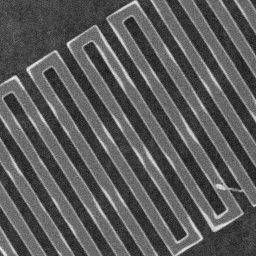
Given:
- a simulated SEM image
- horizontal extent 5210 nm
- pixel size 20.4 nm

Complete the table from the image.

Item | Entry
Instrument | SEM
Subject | groups of lines, slits or small figures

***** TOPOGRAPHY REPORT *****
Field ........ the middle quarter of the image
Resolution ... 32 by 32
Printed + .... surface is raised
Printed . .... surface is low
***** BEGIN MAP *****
+...+++....+++....+++....++++...
+....+++....+++....+++....+++...
++...++++....+++....+++...++++..
++....+++....+++....+++....+++..
+++....+++....+++....+++....+++.
++++...++++...++++...++++...++++
.+++....+++....+++....+++....+++
..+++...++++....+++....+++....++
..++++...++++...++++...++++...++
...+++....+++....+++....+++....+
...++++...++++....+++....+++...+
+...++++...+++....+++....++++...
+....+++....+++....+++....+++...
++...++++....+++...++++...++++..
++....+++....+++....+++....+++..
+++...++++....+++....+++....+++.
++++...+++....++++...++++...+++.
.+++....+++....+++....+++....+++
.++++....+++....+++....+++....++
..++++...+++....+++....+++....++
...+++....+++....+++....+++....+
...++++....+++....+++...++++...+
....+++....+++....+++....+++....
+....+++....+++....+++....+++...
++...++++...++++....++.....+++..
++....+++....+++....+++....+++..
+++...++++...++++....+++....+++.
++++...++++...++++...+++....++++
.+++....+++....+++....+++....+++
.++++...++++....+++....+++....++
..++++...++++...++++...+++....++
...+++....+++....+++....+++....+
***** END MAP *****